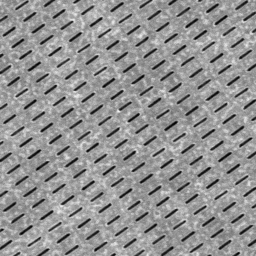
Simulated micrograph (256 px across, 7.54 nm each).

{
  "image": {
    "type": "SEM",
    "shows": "a regular array of holes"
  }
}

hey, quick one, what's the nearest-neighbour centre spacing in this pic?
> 104 nm